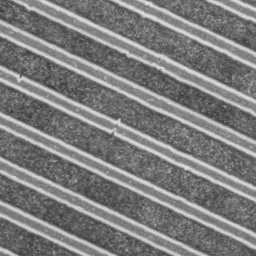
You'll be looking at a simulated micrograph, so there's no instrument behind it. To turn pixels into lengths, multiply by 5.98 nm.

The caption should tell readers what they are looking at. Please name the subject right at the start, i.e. parallel lines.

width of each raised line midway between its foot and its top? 68.2 nm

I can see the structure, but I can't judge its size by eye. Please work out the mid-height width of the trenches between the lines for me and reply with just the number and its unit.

175 nm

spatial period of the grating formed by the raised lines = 242 nanometers